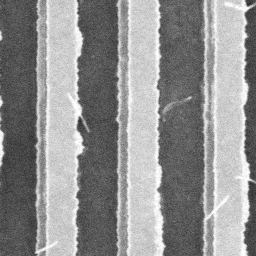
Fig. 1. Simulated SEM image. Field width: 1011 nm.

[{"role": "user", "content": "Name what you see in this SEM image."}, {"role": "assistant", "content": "lines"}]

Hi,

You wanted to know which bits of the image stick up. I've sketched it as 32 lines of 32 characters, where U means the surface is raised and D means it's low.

DDDDDUUUUUDDDDDUUUUUDDDDDDUUUUUD
DDDDDUUUUUDDDDDUUUUUDDDDDDUUUUUD
DDDDDUUUUUDDDDDUUUUUDDDDDDUUUUUD
DDDDDUUUUUDDDDDUUUUUDDDDDDUUUUUD
DDDDDUUUUUDDDDDUUUUUDDDDDDUUUUUD
DDDDDUUUUUDDDDDUUUUUDDDDDDUUUUDD
DDDDDUUUUUDDDDDUUUUUDDDDDDUUUUUD
DDDDDUUUUUDDDDDUUUUUDDDDDDUUUUUD
DDDDDUUUUUDDDDDUUUUUDDDDDDUUUUUD
DDDDDUUUUUDDDDDUUUUUDDDDDDUUUUDD
DDDDDUUUUUDDDDDUUUUUDDDDDDUUUUUD
DDDDDUUUUUDDDDDUUUUUDDDDDDUUUUUD
DDDDDUUUUUDDDDDUUUUUDDDDDDUUUUUD
DDDDDUUUUUDDDDDUUUUUDDDDDDUUUUDD
DDDDDUUUUUDDDDDUUUUUDDDDDDUUUUUD
DDDDDUUUUUDDDDDUUUUUDDDDDDUUUUUD
DDDDDUUUUUDDDDDUUUUUDDDDDDUUUUUD
DDDDDUUUUUDDDDDUUUUUDDDDDDUUUUDD
DDDDDUUUUUDDDDDUUUUUDDDDDDUUUUDD
DDDDDUUUUUDDDDDUUUUUDDDDDDUUUUUD
DDDDDUUUUUDDDDDUUUUUDDDDDDUUUUUD
DDDDDUUUUUDDDDDUUUUUDDDDDDUUUUUD
DDDDDUUUUUDDDDDUUUUUDDDDDDUUUUUD
DDDDDUUUUUDDDDDUUUUUDDDDDDUUUUUD
DDDDDUUUUDDDDDDUUUUUDDDDDDUUUUUD
DDDDDUUUUUDDDDDUUUUUDDDDDDUUUUUD
DDDDDUUUUUDDDDDUUUUUDDDDDDUUUUUD
DDDDDUUUUDDDDDDUUUUUDDDDDDUUUUUD
DDDDDUUUUUDDDDDUUUUUDDDDDDUUUUUD
DDDDDUUUUUDDDDDUUUUUDDDDDDUUUUDD
DDDDDUUUUUDDDDDUUUUUDDDDDDUUUUUD
DDDDDUUUUDDDDDDUUUUUDDDDDDUUUUUD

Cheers